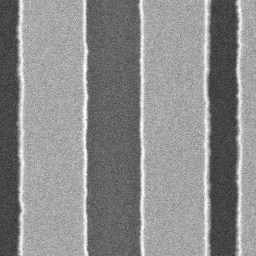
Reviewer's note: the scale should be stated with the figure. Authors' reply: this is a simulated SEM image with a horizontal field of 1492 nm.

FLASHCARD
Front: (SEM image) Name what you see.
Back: lines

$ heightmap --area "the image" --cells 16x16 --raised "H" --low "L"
LHHHHLLLLHHHHLLH
LHHHHLLLLHHHHLLH
LHHHHLLLLHHHHLLH
LHHHHLLLLHHHHLLH
LHHHHLLLLHHHHLLH
LHHHHLLLLHHHHLLH
LHHHHLLLLHHHHLLH
LHHHHLLLLHHHHLLH
LHHHHLLLLHHHHLLH
LHHHHLLLLHHHHLLH
LHHHHLLLLHHHHLLH
LHHHHLLLLHHHHLLH
LHHHHLLLLHHHHLLH
LHHHHLLLLHHHHLLH
LHHHHLLLLHHHHLLH
LHHHHLLLLHHHHLLH